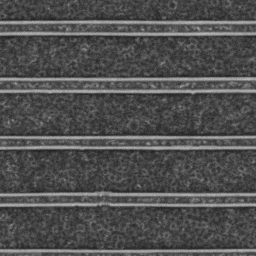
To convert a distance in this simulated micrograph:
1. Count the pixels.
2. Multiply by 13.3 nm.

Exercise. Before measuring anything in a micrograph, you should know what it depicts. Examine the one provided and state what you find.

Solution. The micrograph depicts parallel lines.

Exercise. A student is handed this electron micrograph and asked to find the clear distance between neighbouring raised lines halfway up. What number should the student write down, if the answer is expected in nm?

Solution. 609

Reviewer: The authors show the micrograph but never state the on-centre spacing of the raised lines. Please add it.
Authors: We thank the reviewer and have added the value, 759 nanometres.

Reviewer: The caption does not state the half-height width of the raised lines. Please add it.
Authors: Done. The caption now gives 154 nanometres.